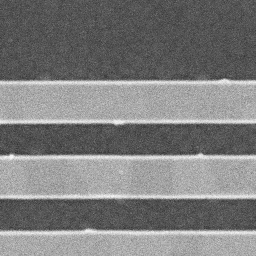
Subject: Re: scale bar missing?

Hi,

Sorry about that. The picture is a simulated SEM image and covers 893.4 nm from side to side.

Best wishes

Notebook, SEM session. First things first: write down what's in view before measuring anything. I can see one or a few lines or trenches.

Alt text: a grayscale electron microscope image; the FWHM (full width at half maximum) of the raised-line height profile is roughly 0.137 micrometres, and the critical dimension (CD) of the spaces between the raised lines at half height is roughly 122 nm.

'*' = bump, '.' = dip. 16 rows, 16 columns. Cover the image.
................
................
................
................
................
****************
****************
****************
................
................
****************
****************
................
................
.....*..........
****************